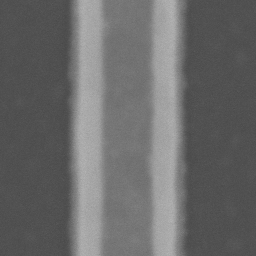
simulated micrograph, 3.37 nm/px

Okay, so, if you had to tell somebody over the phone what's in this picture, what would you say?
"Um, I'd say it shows one or a few lines or trenches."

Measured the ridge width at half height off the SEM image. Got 264 nanometres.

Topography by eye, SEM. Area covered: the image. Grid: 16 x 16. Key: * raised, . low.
......****......
......****......
......****......
......****......
......****......
......****......
......****......
......****......
.....*****......
......****......
......****......
......****......
......****......
......****......
.....*****......
......****......